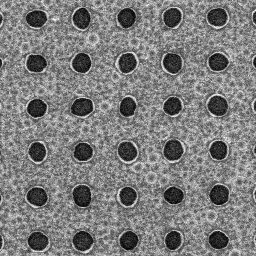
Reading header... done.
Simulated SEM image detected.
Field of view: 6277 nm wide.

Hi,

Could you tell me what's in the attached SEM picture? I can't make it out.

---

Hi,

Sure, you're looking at a regular array of holes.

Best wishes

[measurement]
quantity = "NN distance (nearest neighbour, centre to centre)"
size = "1.08 micrometres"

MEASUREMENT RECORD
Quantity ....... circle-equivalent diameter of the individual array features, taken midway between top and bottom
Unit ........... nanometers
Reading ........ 490